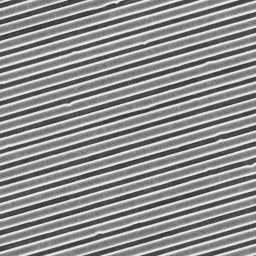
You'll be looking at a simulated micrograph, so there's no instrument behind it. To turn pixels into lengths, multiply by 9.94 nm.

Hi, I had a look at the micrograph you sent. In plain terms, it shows parallel lines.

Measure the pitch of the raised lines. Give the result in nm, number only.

155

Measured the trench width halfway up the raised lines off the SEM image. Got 6.72 pixels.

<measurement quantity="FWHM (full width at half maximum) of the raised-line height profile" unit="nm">95.5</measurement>